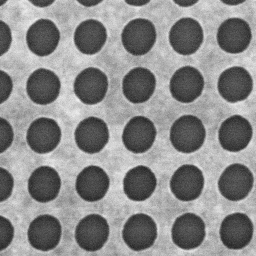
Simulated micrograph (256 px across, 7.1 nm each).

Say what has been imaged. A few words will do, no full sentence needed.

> a regular array of holes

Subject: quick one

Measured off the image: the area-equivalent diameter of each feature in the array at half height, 36.5 pixels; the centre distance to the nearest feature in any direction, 340 nanometers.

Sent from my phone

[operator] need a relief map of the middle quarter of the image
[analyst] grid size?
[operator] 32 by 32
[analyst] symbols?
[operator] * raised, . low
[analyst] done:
******************************..
*****....********....*******....
***.......*****.......*****.....
***........****........****.....
**.........****........***......
**.........***.........***......
**.........***.........***......
***.......*****........****.....
***.......*****.......*****.....
****.....*******.....********...
********************************
********************************
********************************
*****....********....*******....
****.......*****......*****.....
***........****........****.....
***........****........***......
**.........****........***......
***.........**.........***......
***........****........****.....
***.......*****.......*****.....
****......******.....*******....
******.***********..************
********************************
********************************
******..**********...********...
*****.....******......******....
****.......****........****.....
***........****........****.....
***.........***........***......
***........****........***......
***........****........****.....